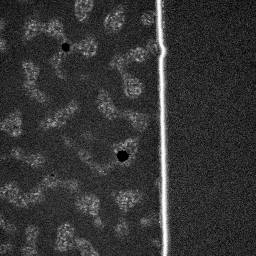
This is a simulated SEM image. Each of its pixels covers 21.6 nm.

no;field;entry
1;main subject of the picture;one or a few lines or trenches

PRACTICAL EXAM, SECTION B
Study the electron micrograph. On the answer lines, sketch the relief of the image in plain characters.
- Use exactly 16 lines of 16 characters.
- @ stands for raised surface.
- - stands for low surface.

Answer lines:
----------@@@@@@
----------@@@@@@
----------@@@@@@
----------@@@@@@
----------@@@@@@
----------@@@@@@
----------@@@@@@
----------@@@@@@
----------@@@@@@
----------@@@@@@
----------@@@@@@
----------@@@@@@
----------@@@@@@
----------@@@@@@
----------@@@@@@
----------@@@@@@